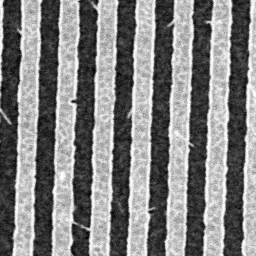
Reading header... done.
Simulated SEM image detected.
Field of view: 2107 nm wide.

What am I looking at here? parallel lines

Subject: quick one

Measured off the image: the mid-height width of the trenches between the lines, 0.171 µm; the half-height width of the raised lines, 0.14 µm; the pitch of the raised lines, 313 nanometers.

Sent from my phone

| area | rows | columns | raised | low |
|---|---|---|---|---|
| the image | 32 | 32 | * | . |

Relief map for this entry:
...**...**..***..**...**...**...
...**...**..**...**...**...**..*
...**...**..***..**...**...**..*
...**...**..**...**...**...**..*
...**..***..**...**...**...**..*
...**..***..**...**...**..***..*
...**..***..**...**...**..***..*
...**..***..**...**...**..***..*
...**..***..**...**...**..***..*
...**..**...**...**...**..**...*
..***..**...**...**...**..***..*
..***..**...**...**...**..**...*
..***..**...**...**..***..**...*
..***..**...**...**..***..**...*
..***..**...**...**..***..**...*
..***..**...**...**..***..**...*
..***..**...**...**..**...**...*
..**...**...**...**..***..**...*
..**...**...**...**..**...**...*
..**...**...**...**..**...**...*
..**...**...**...**..**...**...*
..**...**...**..***..**...**...*
..**...**...**..***..**...**...*
..**...**...**..**...**...**...*
..**...**...**..**...**...**...*
..**...**...**..**...**...**...*
..**...**...**..***..**...**...*
..**...**...**..***..**...**...*
..**...**..***..**...**...**...*
..**...**..***..**...**...**...*
..**...**..***..**...**...**..**
..**...**..***..**...**...**..**